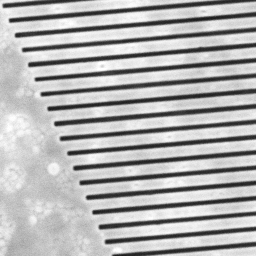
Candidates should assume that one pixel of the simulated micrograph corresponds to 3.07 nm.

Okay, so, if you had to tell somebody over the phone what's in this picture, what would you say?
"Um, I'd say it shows parallel lines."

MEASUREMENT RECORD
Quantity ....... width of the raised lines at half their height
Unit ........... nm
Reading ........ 32.9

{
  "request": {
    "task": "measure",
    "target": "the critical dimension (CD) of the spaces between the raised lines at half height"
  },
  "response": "14.9 nanometres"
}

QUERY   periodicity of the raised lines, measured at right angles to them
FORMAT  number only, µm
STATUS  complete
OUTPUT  0.0468